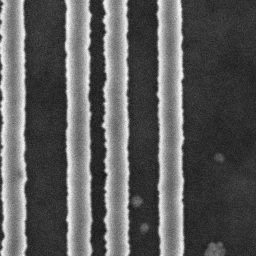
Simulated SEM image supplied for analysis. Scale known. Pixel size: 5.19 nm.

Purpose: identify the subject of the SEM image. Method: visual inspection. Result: lines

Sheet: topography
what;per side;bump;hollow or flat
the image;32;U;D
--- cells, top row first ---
UUUDDDDDUUUDDUUUDDDDUUUDDDDDDDDD
UUUDDDDDUUUDDUUUDDDDUUUDDDDDDDDD
UUUDDDDDUUUDDUUUDDDDUUUDDDDDDDDD
UUUDDDDDUUUDDUUUDDDDUUUDDDDDDDDD
UUUDDDDDUUUDDUUUDDDDUUUDDDDDDDDD
UUUDDDDDUUUDDUUUDDDDUUUDDDDDDDDD
UUUDDDDDUUUDDUUUDDDDUUUDDDDDDDDD
UUUDDDDDUUUDDUUUDDDDUUUDDDDDDDDD
UUUDDDDDUUUDDUUUDDDDUUUDDDDDDDDD
UUUDDDDDUUUDDUUUDDDDUUUDDDDDDDDD
UUUDDDDDUUUDDUUUDDDDUUUDDDDDDDDD
UUUDDDDDUUUDDUUUDDDDUUUDDDDDDDDD
UUUDDDDDUUUDDUUUDDDDUUUDDDDDDDDD
UUUDDDDDUUUDDUUUDDDDUUUDDDDDDDDD
UUUDDDDDUUUDDUUUDDDDUUUDDDDDDDDD
UUUDDDDDUUUDDUUUDDDDUUUDDDDDDDDD
UUUDDDDDUUUDDUUUDDDDUUUDDDDDDDDD
UUUDDDDDUUUDDUUUDDDDUUUDDDDDDDDD
UUUDDDDDUUUDDUUUDDDDUUUDDDDDDDDD
UUUDDDDDUUUDDUUUDDDDUUUDDDDDDDDD
UUUDDDDDDUUDDUUUDDDDUUUDDDDDDDDD
UUUDDDDDUUUDDUUUDDDDUUUDDDDDDDDD
UUUDDDDDUUUDDUUUDDDDUUUDDDDDDDDD
UUUDDDDDUUUDDUUUDDDDUUUDDDDDDDDD
UUUDDDDDUUUDDUUUDDDDUUUDDDDDDDDD
UUUDDDDDDUUDDUUUDDDDUUUDDDDDDDDD
UUUDDDDDDUUDDUUUDDDDUUUDDDDDDDDD
DUUDDDDDUUUDDUUUDDDDUUUDDDDDDDDD
UUUDDDDDDUUDDUUUDDDDUUUDDDDDDDDD
DUUDDDDDUUUDDUUUDDDDUUUDDDDDDDDD
UUUDDDDDUUUDDUUUDDDDUUUDDDDDDDDD
UUUDDDDDDUUDDUUUDDDDUUUDDDDDDDDD